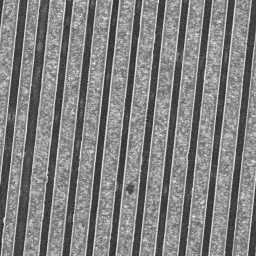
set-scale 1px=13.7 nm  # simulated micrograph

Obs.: parallel lines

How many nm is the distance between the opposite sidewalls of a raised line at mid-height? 216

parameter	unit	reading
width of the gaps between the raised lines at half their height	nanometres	109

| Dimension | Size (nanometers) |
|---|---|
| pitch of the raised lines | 317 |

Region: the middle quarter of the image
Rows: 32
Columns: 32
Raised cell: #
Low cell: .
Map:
.###...###..####..####..####..##
.###..####..####..####..###...##
.###..####..####..####..###...##
####..####..####..####..###..###
####..####..####..###...###..###
####..####..####.####..####..###
####..####..###..####..####..###
####..####..###..####..####..###
####..###..####..####..####..###
###...###..####..####..####..###
###..####..####..####..####..###
###..####..####..####..###...###
###..####..####..####..###..####
###..####..####..###...###..####
###..####..####..###...###..####
###..####..###..####..####..####
###..####..###..####..####..####
###..####.####..####..####..####
##...###..####..####..####..###.
##...###..####..####..####..###.
##..####..####..####..###...###.
##..####..####..####..###...###.
##..####..####..###...###..####.
##..####..####..###...###..####.
##..####..####.####..####..####.
##..###...###..####..####..####.
##..###...###..####..####..####.
#...###..####..####..####..###..
#...###..####..####..####..###..
#..####..####..####..####..###..
#..####..####..####..###...###..
#..####..####..####..###..####..